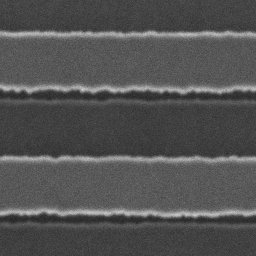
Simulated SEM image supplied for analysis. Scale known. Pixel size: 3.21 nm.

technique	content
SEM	lines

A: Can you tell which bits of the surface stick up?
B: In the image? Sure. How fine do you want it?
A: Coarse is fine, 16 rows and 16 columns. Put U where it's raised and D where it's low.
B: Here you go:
DDDDDDDDDDDDDDDD
DDDDDDDDDDDDDDDD
UUUUUUUUUUUUUUUU
UUUUUUUUUUUUUUUU
UUUUUUUUUUUUUUUU
UUUUUUUUUUUUUUUU
DDDDDDDDDDDDDDDD
DDDDDDDDDDDDDDDD
DDDDDDDDDDDDDDDD
DDDDDDDDDDDDDDDD
UUUUUUUUUUUUUUUU
UUUUUUUUUUUUUUUU
UUUUUUUUUUUUUUUU
DDDDDDDDDDUDDDDD
DDDDDDDDDDDDDDDD
DDDDDDDDDDDDDDDD